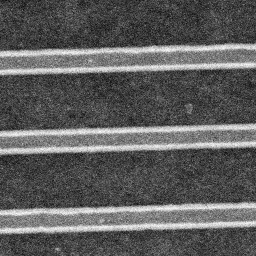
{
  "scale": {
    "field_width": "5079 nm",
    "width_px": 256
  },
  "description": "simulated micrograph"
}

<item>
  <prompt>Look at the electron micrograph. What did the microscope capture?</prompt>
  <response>one or a few lines or trenches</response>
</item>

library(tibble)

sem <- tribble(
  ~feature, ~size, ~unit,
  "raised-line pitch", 1580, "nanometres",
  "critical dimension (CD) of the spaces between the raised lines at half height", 1.2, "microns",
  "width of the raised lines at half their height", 0.369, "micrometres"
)